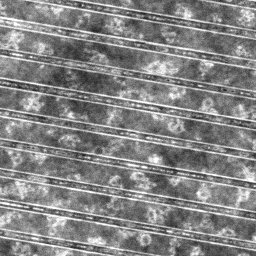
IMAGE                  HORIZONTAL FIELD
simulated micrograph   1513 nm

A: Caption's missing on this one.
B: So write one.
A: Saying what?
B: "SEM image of parallel lines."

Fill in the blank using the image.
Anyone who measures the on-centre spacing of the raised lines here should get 175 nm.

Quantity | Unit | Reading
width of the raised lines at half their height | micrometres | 0.134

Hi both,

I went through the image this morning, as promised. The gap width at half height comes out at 40.8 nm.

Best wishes